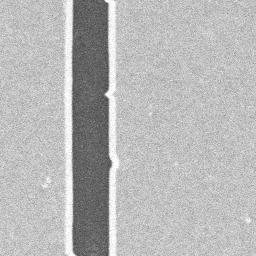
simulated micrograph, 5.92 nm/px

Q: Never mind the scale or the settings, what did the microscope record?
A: one or a few lines or trenches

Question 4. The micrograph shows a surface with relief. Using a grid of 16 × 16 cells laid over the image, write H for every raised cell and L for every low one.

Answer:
HHHHLLLHHHHHHHHH
HHHHLLLHHHHHHHHH
HHHHLLLHHHHHHHHH
HHHHLLLHHHHHHHHH
HHHHLLLHHHHHHHHH
HHHHLLLHHHHHHHHH
HHHHLLLHHHHHHHHH
HHHHLLLHHHHHHHHH
HHHHLLLHHHHHHHHH
HHHHLLLHHHHHHHHH
HHHHLLLHHHHHHHHH
HHHHLLLHHHHHHHHH
HHHHLLLHHHHHHHHH
HHHHLLLHHHHHHHHH
HHHHLLLHHHHHHHHH
HHHHLLLHHHHHHHHH